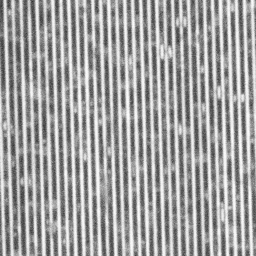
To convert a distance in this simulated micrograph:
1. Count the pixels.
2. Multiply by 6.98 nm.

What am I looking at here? parallel lines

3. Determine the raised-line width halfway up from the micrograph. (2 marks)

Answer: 11.3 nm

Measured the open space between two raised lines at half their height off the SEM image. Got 0.0471 microns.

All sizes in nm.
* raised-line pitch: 55.7